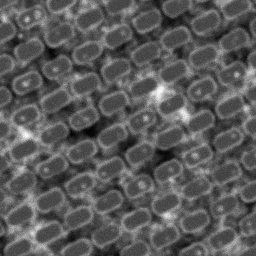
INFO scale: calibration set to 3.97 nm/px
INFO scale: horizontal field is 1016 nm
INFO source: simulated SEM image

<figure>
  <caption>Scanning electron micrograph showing a regular array of raised bodies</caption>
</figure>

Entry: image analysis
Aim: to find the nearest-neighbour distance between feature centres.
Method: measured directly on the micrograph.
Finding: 131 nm